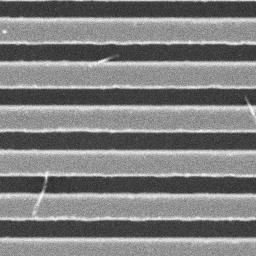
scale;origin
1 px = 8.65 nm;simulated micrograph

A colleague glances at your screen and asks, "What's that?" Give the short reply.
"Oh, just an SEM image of lines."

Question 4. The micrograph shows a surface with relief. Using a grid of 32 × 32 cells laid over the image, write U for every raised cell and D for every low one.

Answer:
DDDDDDDDDDDDDDDDDDDDDDDDDDDDDDDD
DDDDDDDDDDDDDDDDDDDDDDDDDDDDDDDD
UUUUUUUUUUUUUUUUUUUUUUUUUUUUUUUU
UUUUUUUUUUUUUUUUUUUUUUUUUUUUUUUU
UUUUUUUUUUUUUUUUUUUUUUUUUUUUUUUU
DDUUUDDDDDDUUUUUUUUDUUDUDDDDUUUU
DDDDDDDDDDDDDDDDDDDDDDDDDDDDDDDD
DDDDDDDDDDDDDUDDDDDDDDDDDDDDDDDD
UUUUUUUUUUUUUUUUUUUUUUUUUUUUUUUU
UUUUUUUUUUUUUUUUUUUUUUUUUUUUUUUU
UUUUUUUUUUUUUUUUUUUUUUUUUUUUUUUU
DDDDDDDDDDDDDDDDDDDDDDDDDDDDDDDD
DDDDDDDDDDDDDDDDDDDDDDDDDDDDDDDD
UUUUUUUUUUUUUUUUUUUUUUUUUUUUUUUU
UUUUUUUUUUUUUUUUUUUUUUUUUUUUUUUU
UUUUUUUUUUUUUUUUUUUUUUUUUUUUUUUU
DDDDDDDDDDDDDDDDDDDDDDDDDDDDDDDD
DDDDDDDDDDDDDDDDDDDDDDDDDDDDDDDD
DDDDDDDDDDDDDDDDDDDDDDDDDDDDDDDD
UUUUUUUUUUUUUUUUUUUUUUUUUUUUUUUU
UUUUUUUUUUUUUUUUUUUUUUUUUUUUUUUU
UUUUUUUUUUUUUUUUUUUUUUUUUUUUUUUU
DDDDDDDDDDDDDDDDDDDDDDDDDDDDDDDD
DDDDDDDDDDDDDDDDDDDDDDDDDDDDDDDD
UUUUUUUUUUUUUUUUUUUUUUUUUUUUUUUU
UUUUUUUUUUUUUUUUUUUUUUUUUUUUUUUU
UUUUUUUUUUUUUUUUUUUUUUUUUUUUUUUU
DUUDUUDDDDUUDDDDUUUDDDDUDDUDUDUU
DDDDDDDDDDDDDDDDDDDDDDDDDDDDDDDD
DDDDDDDDDDDDDDDDDDDDDDDDDDDDDDDD
UUUUUUUUUUUUUUUUUUUUUUUUUUUUUUUU
UUUUUUUUUUUUUUUUUUUUUUUUUUUUUUUU